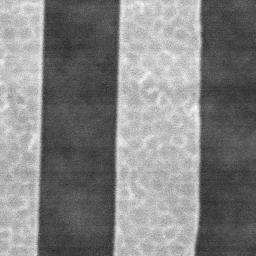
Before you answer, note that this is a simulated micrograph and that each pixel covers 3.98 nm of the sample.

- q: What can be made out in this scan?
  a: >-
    one or a few lines or trenches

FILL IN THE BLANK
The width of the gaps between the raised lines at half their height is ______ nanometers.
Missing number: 311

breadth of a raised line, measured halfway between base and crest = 80 pixels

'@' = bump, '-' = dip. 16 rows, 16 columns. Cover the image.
@@@-----@@@@----
@@@-----@@@@----
@@@-----@@@@----
@@@-----@@@@----
@@@----@@@@@----
@@@----@@@@@----
@@@----@@@@@----
@@-----@@@@@----
@@-----@@@@@----
@@-----@@@@@----
@@-----@@@@@----
@@-----@@@@@----
@@-----@@@@@----
@@-----@@@@@----
@@-----@@@@@----
@@-----@@@@@----